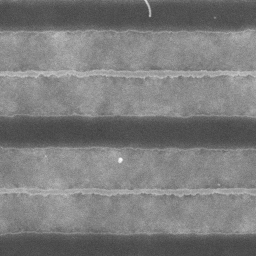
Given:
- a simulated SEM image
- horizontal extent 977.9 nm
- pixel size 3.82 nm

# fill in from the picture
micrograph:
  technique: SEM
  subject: lines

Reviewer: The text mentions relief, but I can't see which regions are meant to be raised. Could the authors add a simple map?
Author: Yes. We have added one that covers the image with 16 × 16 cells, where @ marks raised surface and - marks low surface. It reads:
@@@@@@@@@@@@@@@@
@@@@@@@@@@@@@@@@
----------------
----------------
----------------
----------------
----------------
@@@@@@@@@@@@@@@@
@@@@@@@@@@@@@@@@
----------------
----------------
----------------
----------------
----------------
----------------
@@@@@@@@@@@@@@@@